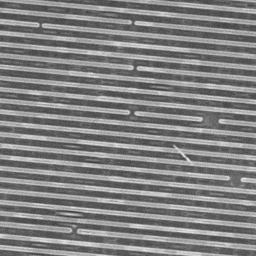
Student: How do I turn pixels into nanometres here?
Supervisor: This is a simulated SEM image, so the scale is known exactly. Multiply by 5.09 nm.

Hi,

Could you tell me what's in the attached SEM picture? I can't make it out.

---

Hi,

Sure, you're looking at parallel lines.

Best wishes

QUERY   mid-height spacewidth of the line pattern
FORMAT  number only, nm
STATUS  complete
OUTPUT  36.7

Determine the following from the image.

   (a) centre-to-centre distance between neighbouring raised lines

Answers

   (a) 57.1 nm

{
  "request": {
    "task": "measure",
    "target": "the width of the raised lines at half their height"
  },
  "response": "0.0183 µm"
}